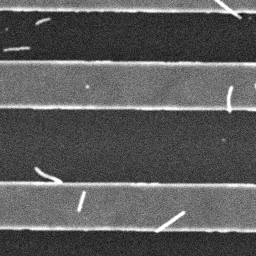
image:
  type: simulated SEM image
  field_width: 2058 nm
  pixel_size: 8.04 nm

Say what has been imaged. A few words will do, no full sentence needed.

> lines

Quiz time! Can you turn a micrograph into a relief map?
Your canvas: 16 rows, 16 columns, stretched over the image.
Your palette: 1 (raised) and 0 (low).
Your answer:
1111111111111111
0000000000000000
0000000000000000
0000000000000000
1111111111111111
1111111111111111
1111111111111111
0000000000000000
0000000000000000
0000000000000000
0000000000000000
1111111111000000
1111111111111111
1111111111111111
0000000000000000
0000000000000000